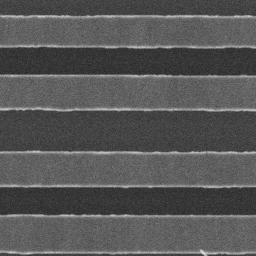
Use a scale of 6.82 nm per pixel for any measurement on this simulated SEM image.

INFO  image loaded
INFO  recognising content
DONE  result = lines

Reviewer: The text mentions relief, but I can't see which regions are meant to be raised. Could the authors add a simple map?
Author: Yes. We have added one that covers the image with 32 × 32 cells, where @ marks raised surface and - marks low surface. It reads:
--------------------------------
--------------------------------
@@@@@@@@@@@@@@@@@@@@@@@@@@@@@@@@
@@@@@@@@@@@@@@@@@@@@@@@@@@@@@@@@
@@@@@@@@@@@@@@@@@@@@@@@@@@@@@@@@
@@@@@@@@@@@@@@@@@@@@@@@@@@@@@@@@
--------------------------------
--------------------------------
--------------------------------
@@@@@@@@@@@@@@@@@@@@@@@---@---@-
@@@@@@@@@@@@@@@@@@@@@@@@@@@@@@@@
@@@@@@@@@@@@@@@@@@@@@@@@@@@@@@@@
@@@@@@@@@@@@@@@@@@@@@@@@@@@@@@@@
@@@@@@@@@@@@@@@@@@@@@@@@@@@@@@@@
--------------------------------
--------------------------------
--------------------------------
--------------------------------
--------------------------------
@@@@@@@@@@@@@@@@@@@@@@@@@@@@@@@@
@@@@@@@@@@@@@@@@@@@@@@@@@@@@@@@@
@@@@@@@@@@@@@@@@@@@@@@@@@@@@@@@@
@@@@@@@@@@@@@@@@@@@@@@@@@@@@@@@@
--------------------------------
--------------------------------
--------------------------------
--------------------------------
@@@@@@@@@@@@@@@@@@@@@@@@@@@@@@@@
@@@@@@@@@@@@@@@@@@@@@@@@@@@@@@@@
@@@@@@@@@@@@@@@@@@@@@@@@@@@@@@@@
@@@@@@@@@@@@@@@@@@@@@@@@@@@@@@@@
-@@@@@@@@@@@@@@@@@@@@@@@@@@@@@@@